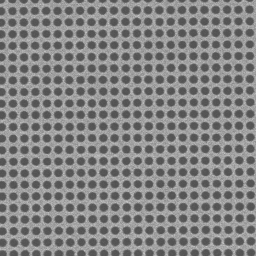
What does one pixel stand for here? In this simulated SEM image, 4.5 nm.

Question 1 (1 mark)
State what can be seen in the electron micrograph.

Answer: a regular array of holes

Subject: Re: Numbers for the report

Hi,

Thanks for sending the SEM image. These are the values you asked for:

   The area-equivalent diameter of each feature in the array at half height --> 35.5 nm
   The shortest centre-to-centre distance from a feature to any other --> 11.1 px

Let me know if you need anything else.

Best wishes